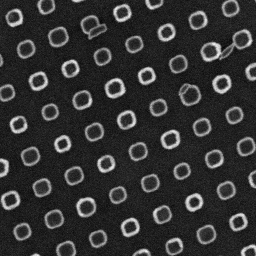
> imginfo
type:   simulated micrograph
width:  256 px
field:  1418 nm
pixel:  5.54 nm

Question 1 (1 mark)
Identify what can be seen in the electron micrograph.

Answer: a regular array of raised bodies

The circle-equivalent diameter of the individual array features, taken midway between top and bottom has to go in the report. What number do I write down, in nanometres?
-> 94.8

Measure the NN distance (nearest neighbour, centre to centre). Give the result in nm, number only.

186